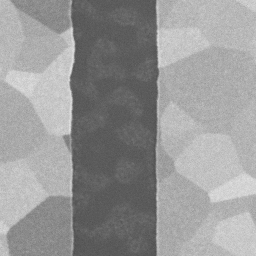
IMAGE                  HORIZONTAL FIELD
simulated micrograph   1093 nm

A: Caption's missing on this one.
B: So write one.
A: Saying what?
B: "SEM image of one or a few lines or trenches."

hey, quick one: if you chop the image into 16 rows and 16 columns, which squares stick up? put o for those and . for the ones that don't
oooo......oooooo
oooo......oooooo
ooooo.....oooooo
ooooo.....oooooo
oooo......oooooo
oooo......oooooo
oooo......oooooo
oooo......oooooo
oooo......oooooo
oooo......oooooo
oooo......oooooo
oooo......oooooo
oooo......oooooo
ooooo.....oooooo
ooooo.....oooooo
ooooo.....oooooo